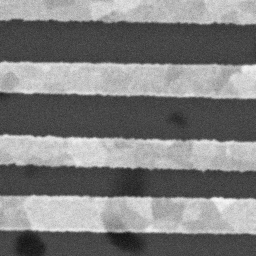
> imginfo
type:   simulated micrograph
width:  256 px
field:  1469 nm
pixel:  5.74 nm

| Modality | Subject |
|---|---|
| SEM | lines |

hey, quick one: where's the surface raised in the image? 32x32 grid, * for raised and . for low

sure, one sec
********************************
********************************
...*...*************************
................................
................................
................................
................................
................................
********************************
********************************
********************************
********************************
................................
................................
................................
................................
................................
*****************...............
********************************
********************************
..*.****************************
................................
................................
................................
................................
********************************
********************************
********************************
********************************
................................
................................
................................